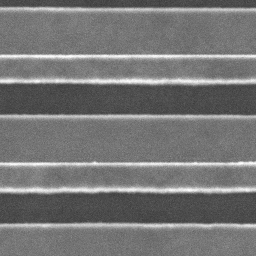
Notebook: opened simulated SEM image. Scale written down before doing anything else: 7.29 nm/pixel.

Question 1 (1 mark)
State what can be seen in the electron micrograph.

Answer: lines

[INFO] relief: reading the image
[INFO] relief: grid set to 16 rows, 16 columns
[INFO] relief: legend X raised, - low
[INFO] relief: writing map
----------------
XXXXXXXXXXXXXXXX
XXXXXXXXXXXXXXXX
XXXXXXXXXXXXXXXX
XXXXXXXXXXXXXXXX
----------------
----------------
XXXXXXXXXXXXXXXX
XXXXXXXXXXXXXXXX
XXXXXXXXXXXXXXXX
XXXXXXXXXXXXXXXX
XXXXXXXXXXXXXXXX
----------------
----------------
XXXXXXXXXXXXXXXX
XXXXXXXXXXXXXXXX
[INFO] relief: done